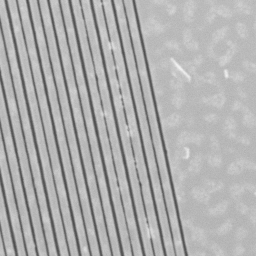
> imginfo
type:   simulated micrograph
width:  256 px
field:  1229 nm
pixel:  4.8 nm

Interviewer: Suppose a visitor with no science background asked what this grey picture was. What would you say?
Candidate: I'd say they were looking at parallel lines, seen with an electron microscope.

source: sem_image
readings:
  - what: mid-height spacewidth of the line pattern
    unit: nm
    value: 12.4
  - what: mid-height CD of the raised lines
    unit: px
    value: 8.44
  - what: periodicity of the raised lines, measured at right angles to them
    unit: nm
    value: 49.8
